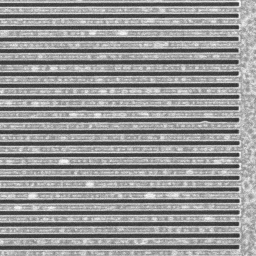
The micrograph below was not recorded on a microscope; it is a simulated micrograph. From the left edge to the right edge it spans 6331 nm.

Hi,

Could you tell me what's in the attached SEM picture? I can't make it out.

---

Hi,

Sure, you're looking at parallel lines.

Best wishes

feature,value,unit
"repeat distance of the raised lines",286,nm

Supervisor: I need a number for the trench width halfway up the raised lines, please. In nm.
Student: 130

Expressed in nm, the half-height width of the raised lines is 155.